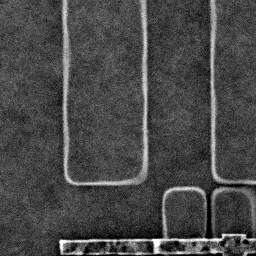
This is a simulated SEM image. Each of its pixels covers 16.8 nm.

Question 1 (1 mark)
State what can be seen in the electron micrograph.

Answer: wiring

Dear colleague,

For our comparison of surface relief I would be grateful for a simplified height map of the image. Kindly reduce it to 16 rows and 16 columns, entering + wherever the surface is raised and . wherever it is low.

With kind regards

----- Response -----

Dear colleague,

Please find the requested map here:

....+++++....+++
....+++++....+++
....+++++....+++
....+++++....+++
....+++++....+++
....+++++....+++
....+++++....+++
....+++++....+++
....+++++....+++
....+++++....+++
....+++++....+++
..............+.
..........++++++
..........++++++
..........++++++
....++++++++++++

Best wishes